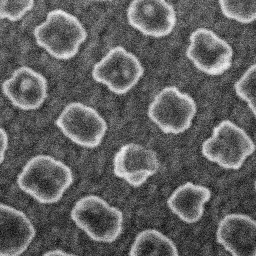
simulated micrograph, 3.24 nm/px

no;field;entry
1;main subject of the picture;a regular array of raised bodies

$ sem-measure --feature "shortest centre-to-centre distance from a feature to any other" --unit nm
211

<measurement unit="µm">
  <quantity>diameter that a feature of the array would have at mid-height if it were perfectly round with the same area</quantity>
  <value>0.14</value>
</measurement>